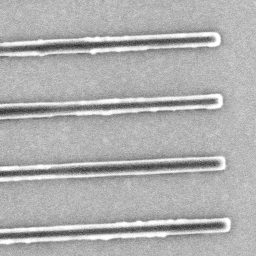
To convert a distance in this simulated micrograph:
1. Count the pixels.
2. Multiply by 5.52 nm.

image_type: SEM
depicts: one or a few lines or trenches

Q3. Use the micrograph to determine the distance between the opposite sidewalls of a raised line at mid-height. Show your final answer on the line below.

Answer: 78.6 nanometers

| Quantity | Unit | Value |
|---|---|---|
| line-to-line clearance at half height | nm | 269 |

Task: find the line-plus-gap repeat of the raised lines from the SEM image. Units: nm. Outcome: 342